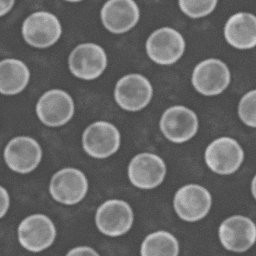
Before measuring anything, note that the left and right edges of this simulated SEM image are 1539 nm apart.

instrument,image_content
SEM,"a regular array of raised bodies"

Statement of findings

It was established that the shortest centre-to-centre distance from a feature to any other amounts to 333 nanometres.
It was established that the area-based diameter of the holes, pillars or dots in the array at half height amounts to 206 nm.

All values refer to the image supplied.